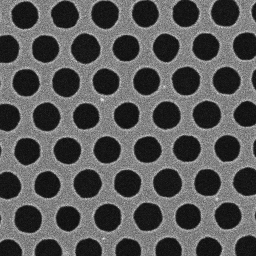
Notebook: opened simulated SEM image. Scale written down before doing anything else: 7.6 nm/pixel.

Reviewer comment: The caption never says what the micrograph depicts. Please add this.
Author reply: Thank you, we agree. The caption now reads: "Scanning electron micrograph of a regular array of holes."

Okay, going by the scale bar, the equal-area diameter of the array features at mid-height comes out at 207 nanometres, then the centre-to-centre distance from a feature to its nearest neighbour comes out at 297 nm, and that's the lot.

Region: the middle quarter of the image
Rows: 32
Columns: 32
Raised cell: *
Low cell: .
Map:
********************************
..*******..********....*****....
...*****.....*****......***.....
....***.......***.......***.....
....***.......***.......***.....
....***.......***.......***.....
....****.....*****.....*****....
...******...*******...*******...
********************************
*************************.******
***....*******....*****.....****
***.....*****......****......***
**.......***.......***.......***
**.......***.......***.......***
**.......****......****......***
***.....******....*****.....****
********************************
********************************
..*******...*******....******...
...*****.....*****......****....
....****......****......***.....
....***.......***.......***.....
....****......****......****....
....****......****......****....
...******...*******...********.*
********************************
*****..********..********..*****
***.....*****.....*****......***
***......****......****......***
**.......***.......***.......***
**.......***.......***........**
***......****......****......***